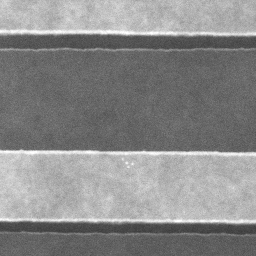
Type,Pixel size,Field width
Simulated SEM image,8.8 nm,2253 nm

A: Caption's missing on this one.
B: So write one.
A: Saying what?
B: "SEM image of lines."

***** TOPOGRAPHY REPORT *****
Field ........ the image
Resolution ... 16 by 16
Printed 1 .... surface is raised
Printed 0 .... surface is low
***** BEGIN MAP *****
1111111111111111
1111111111111111
0000000000000000
0000000000000000
0000000000000000
0000000000000000
0000000000000000
0000000000000000
0000000000000000
1111111000000000
1111111111111111
1111111111111111
1111111111111111
1111111111111111
0000000000000000
0000000000000000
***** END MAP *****